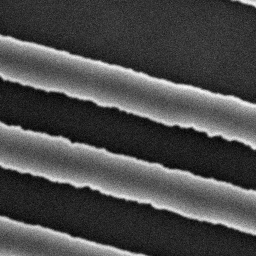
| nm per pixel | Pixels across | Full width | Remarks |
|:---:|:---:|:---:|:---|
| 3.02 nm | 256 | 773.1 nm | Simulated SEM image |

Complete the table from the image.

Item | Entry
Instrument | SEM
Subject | lines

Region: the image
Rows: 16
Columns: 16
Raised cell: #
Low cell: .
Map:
................
................
#...............
#####...........
#########.......
..##########....
......##########
..........######
###...........##
#######.........
##########......
....##########..
........########
............####
####...........#
#######.........